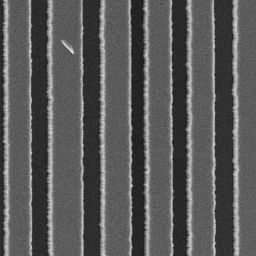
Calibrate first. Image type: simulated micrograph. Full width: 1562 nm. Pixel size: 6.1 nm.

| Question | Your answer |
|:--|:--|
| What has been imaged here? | lines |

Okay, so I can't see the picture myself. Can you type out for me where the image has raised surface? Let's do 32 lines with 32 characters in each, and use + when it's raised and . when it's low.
.+++..++++...+++..++++.++++..+++
.+++..++++...+++..+++..++++..+++
.+++..++++...+++..++++..+++..+++
.+++..++++...+++..++++..+++..+++
.+++..++++..++++..++++..+++..+++
.+++..++++...+++..++++..+++..+++
.+++..++++...+++..++++..+++..+++
.+++..++++...+++..+++..++++..+++
.+++..++++...+++..++++..+++..+++
.+++..++++...+++..++++..+++..+++
.+++..++++...+++..++++..+++..+++
.+++..++++...+++..++++..+++..+++
.+++..++++...+++..++++..+++..+++
.+++..++++...+++..++++..+++..+++
.+++..++++...+++..++++..+++..+++
.+++..++++...+++..++++..+++..+++
.+++..++++...+++..++++..+++..+++
.+++..++++...+++..++++..+++..+++
.+++..++++...+++..++++..+++..+++
.+++..++++...+++..++++..+++..+++
.+++..++++...+++..++++..+++..+++
.+++..++++...+++..++++..+++..+++
.+++..++++...+++..++++..+++..+++
.+++..++++...+++..++++..+++..+++
.+++..++++...+++..++++..+++..+++
.+++..++++...+++..++++..+++..+++
.+++..++++...+++..++++..+++..+++
.+++..++++...+++..++++..+++..+++
.+++..++++...+++..++++..+++..+++
.+++..++++...+++..++++..+++..+++
.+++..++++...+++..++++..+++..+++
.+++..++++...+++..++++..+++..+++